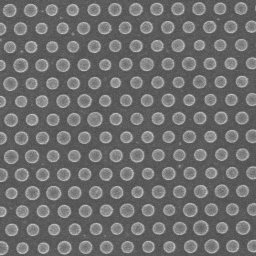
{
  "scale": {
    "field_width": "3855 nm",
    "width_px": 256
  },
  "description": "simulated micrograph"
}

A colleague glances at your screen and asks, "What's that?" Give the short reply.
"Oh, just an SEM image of a regular array of raised bodies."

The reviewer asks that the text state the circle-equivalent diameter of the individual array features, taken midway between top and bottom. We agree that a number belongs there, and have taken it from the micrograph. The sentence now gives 0.182 micrometres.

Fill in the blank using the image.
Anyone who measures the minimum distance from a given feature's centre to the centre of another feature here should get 313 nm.